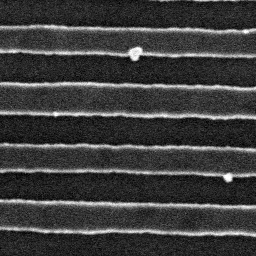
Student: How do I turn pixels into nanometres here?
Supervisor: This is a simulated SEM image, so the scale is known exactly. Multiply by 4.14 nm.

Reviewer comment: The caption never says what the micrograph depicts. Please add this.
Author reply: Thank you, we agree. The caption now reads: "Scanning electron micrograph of lines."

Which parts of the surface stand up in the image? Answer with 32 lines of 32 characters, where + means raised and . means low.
................................
................................
................................
+++++++++++++...................
++++++++++++++++++++++++++++++++
++++++++++++++++++++++++++++++++
++++++++++++++++++++++++++++++++
................................
................................
................................
++++++++++++++.+................
++++++++++++++++++++++++++++++++
++++++++++++++++++++++++++++++++
++++++++++++++++++++++++++++++++
................++++++++++++++++
................................
................................
................................
+++++++++++++++++++++++++++++...
++++++++++++++++++++++++++++++++
++++++++++++++++++++++++++++++++
...............+++++++++++++++++
............................+...
................................
................................
++++++++++++++++++++............
++++++++++++++++++++++++++++++++
++++++++++++++++++++++++++++++++
++++++++++++++++++++++++++++++++
...............................+
................................
................................